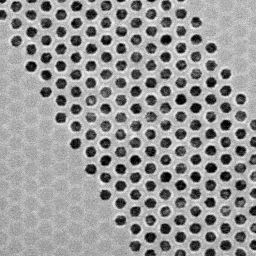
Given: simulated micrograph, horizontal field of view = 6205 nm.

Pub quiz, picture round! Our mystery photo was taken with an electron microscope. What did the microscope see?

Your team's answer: a regular array of holes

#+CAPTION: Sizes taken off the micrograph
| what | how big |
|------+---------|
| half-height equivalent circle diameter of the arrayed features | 284 nm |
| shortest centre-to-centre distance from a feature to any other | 411 nm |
